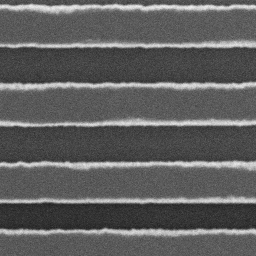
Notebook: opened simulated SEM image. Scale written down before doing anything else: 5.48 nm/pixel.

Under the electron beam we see lines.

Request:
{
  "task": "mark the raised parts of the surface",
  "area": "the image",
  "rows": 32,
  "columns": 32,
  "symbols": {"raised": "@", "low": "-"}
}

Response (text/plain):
--------------------------------
@@@@@@@@@@@@@@@@@@@@@@@@@@@@@@@@
@@@@@@@@@@@@@@@@@@@@@@@@@@@@@@@@
@@@@@@@@@@@@@@@@@@@@@@@@@@@@@@@@
@@@@@@@@@@@@@@@@@@@@@@@@@@@@@@@@
@@@@@@@@@@@@@@@@@@@@@@@@@@@@@@@@
--------------------------------
--------------------------------
--------------------------------
--------------------------------
------@@@@---@@@@--@@@--@-----@@
@@@@@@@@@@@@@@@@@@@@@@@@@@@@@@@@
@@@@@@@@@@@@@@@@@@@@@@@@@@@@@@@@
@@@@@@@@@@@@@@@@@@@@@@@@@@@@@@@@
@@@@@@@@@@@@@@@@@@@@@@@@@@@@@@@@
@@@@@@@@@@@@@@@@@@@@@@@@@@@@@@@-
--------------------------------
--------------------------------
--------------------------------
--------------------------------
@@@@@@@@@@@@@@@@@@@@@@@@@@@@@@@@
@@@@@@@@@@@@@@@@@@@@@@@@@@@@@@@@
@@@@@@@@@@@@@@@@@@@@@@@@@@@@@@@@
@@@@@@@@@@@@@@@@@@@@@@@@@@@@@@@@
@@@@@@@@@@@@@@@@@@@@@@@@@@@@@@@@
--------------------------------
--------------------------------
--------------------------------
--------------------------------
@@@@@@@@@@@@@@@@@@@@@@@@@@@@@@@@
@@@@@@@@@@@@@@@@@@@@@@@@@@@@@@@@
@@@@@@@@@@@@@@@@@@@@@@@@@@@@@@@@